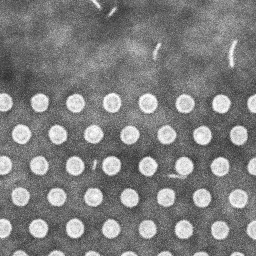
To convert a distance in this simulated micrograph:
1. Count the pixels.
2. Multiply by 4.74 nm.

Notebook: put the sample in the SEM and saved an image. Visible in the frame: a regular array of raised bodies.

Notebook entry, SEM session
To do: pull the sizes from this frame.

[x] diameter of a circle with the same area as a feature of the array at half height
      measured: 79.9 nm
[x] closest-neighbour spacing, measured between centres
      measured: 170 nm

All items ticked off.